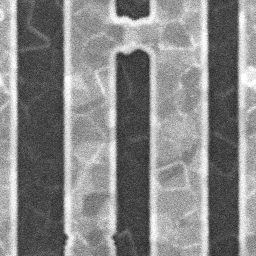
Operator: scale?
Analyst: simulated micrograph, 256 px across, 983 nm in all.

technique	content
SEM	one or a few lines or trenches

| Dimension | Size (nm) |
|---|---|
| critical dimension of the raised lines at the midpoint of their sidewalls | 194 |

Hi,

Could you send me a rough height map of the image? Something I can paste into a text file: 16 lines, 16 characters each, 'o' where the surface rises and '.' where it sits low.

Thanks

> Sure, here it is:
o...ooo...ooo..o
o...ooooooooo..o
o...ooooooooo..o
o...ooo..oooo..o
o...ooo...ooo..o
o...ooo...ooo..o
o...ooo...ooo..o
o...ooo...ooo..o
o...ooo...ooo..o
o...ooo...ooo..o
o...ooo...ooo..o
o...ooo...ooo..o
o...ooo...ooo..o
o...ooo...ooo..o
o...ooo...ooo..o
o...ooo...ooo..o